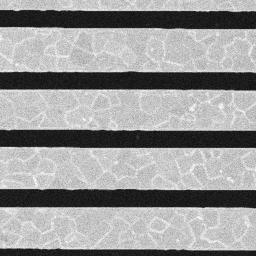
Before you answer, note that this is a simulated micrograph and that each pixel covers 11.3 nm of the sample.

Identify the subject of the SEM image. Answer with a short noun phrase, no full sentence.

lines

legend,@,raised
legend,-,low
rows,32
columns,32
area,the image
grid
@@@@@@@@@@@@@@@@@@@@@@@@@@@@@@@@
--------------------------------
--------------------------------
@@@@@@@@------------------------
@@@@@@@@@@@@@@@@@@@@@@@@@@@@@@@@
@@@@@@@@@@@@@@@@@@@@@@@@@@@@@@@@
@@@@@@@@@@@@@@@@@@@@@@@@@@@@@@@@
@@@@@@@@@@@@@@@@@@@@@@@@@@@@@@@@
@@@@@@@@@@@@@@@@@@@@@@@@@@@@@@@@
--------------------------------
--------------------------------
@@@@@@@@@@@@@@@@@@@@@@@@@@@@@@@@
@@@@@@@@@@@@@@@@@@@@@@@@@@@@@@@@
@@@@@@@@@@@@@@@@@@@@@@@@@@@@@@@@
@@@@@@@@@@@@@@@@@@@@@@@@@@@@@@@@
@@@@@@@@@@@@@@@@@@@@@@@@@@@@@@@@
--------------------------------
--------------------------------
@@@@@@@@@@----------------------
@@@@@@@@@@@@@@@@@@@@@@@@@@@@@@@@
@@@@@@@@@@@@@@@@@@@@@@@@@@@@@@@@
@@@@@@@@@@@@@@@@@@@@@@@@@@@@@@@@
@@@@@@@@@@@@@@@@@@@@@@@@@@@@@@@@
@@@@@@@@@@@@@@@@@@@@@@@@@@@@@@@@
--------------------------------
--------------------------------
@@@@@@@@@@@@@@@@@@@@@@@@@@@@@@@@
@@@@@@@@@@@@@@@@@@@@@@@@@@@@@@@@
@@@@@@@@@@@@@@@@@@@@@@@@@@@@@@@@
@@@@@@@@@@@@@@@@@@@@@@@@@@@@@@@@
@@@@@@@@@@@@@@@@@@@@@@@@@@@@@@@@
--------------------------------